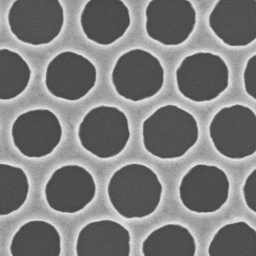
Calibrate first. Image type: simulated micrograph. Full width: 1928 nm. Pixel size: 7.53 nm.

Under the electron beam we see a regular array of holes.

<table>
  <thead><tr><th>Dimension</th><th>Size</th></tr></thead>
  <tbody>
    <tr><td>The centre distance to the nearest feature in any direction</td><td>488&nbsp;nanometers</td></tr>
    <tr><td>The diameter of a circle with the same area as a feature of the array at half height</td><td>382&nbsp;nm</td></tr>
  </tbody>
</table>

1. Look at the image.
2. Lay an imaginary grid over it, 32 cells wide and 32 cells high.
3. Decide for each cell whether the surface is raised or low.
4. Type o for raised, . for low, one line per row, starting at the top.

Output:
oo.....oooo....oooo.....ooo.....
o.......oo......oo......oo......
o.......oo......oo......oo......
o.......oo......oo......oo......
oo.....oooo....oooo.....ooo.....
oooo.ooooooooooooooo..oooooo...o
..oooooo.ooooooo...ooooooooooooo
...oooo....oooo.....ooo.....ooo.
....oo......oo......oo......ooo.
....oo......oo......oo.......o..
....oo......oo......oo......ooo.
...ooo.....oooo.....ooo.....ooo.
ooooooooooooooooo.oooooo..oooooo
oooooooooooo..oooooo...ooooo...o
oo.....oooo.....ooo.....ooo.....
oo.....ooo......oo.......o......
o.......oo......oo.......o......
oo.....ooo......oo.......o......
oo.....oooo....ooo......ooo.....
ooo...oooooo..oooooo...ooooo...o
oooooooooooooooooooooooooooooooo
...oooo....ooo.....ooooo....oooo
...ooo......oo......ooo.....ooo.
....oo......o.......oo.......o..
...ooo......oo......ooo.....oo..
...ooo.....ooo......ooo.....ooo.
.oooooo...ooooo....ooooo...ooooo
oooooooooooooooooooooooooooooooo
ooo....ooo......oooo...ooooo....
oo.....ooo......ooo.....ooo.....
o.......oo......oo......oo......
o......ooo......oo......oo......